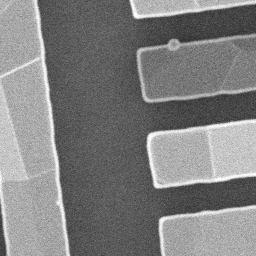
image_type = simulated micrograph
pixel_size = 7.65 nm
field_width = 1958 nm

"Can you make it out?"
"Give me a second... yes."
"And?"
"groups of lines, slits or small figures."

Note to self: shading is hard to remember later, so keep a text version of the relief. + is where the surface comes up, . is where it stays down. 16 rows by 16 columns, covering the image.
++......+++++...
++..............
+++...........++
+++......+++++++
+++......+++++++
+++......+++++++
+++.............
+++.............
+++.......++++++
+++......+++++++
++++.....+++++++
++++......+.....
++++............
++++.......+++++
++++......++++++
++++......++++++